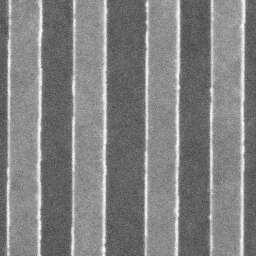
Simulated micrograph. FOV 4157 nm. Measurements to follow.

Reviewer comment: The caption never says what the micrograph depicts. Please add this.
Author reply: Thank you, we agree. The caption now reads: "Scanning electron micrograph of lines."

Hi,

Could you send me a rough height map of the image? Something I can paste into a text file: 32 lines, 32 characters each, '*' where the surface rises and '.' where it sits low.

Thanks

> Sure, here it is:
.****....****.....****.....****.
.****....****.....****.....****.
.****....****.....****.....****.
.****....****.....****.....***..
.****....****.....****.....***..
.****....****.....****.....***..
.****....****.....****.....***..
.****....****.....****.....***..
.****....****.....****.....***..
.****....****.....****.....***..
.****....****.....****.....***..
.****....****.....****....****..
.****....****.....****.....***..
.****....****.....****....****..
.****....****.....****....****..
.****....****.....****....****..
.****....****.....****....****..
.****....****.....****....****..
.****....****.....****....****..
.****....****.....****....****..
.****....****.....****....****..
.****....****.....****....****..
.****....****.....****....****..
.****....****.....****....****..
.****....****.....****....****..
.****....****.....****....****..
.****....****.....****....****..
.****....****.....****....****..
.****....****.....****....****..
.****....****.....****....****..
.****....****.....****....****..
.****....****.....****....****..